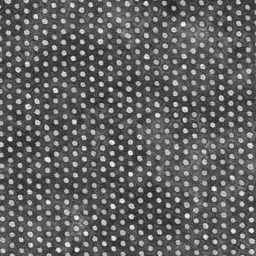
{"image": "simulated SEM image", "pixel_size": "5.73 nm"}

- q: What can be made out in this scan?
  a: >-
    a regular array of raised bodies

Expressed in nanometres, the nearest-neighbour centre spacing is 59.5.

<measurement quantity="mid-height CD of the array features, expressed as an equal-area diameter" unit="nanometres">28.2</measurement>